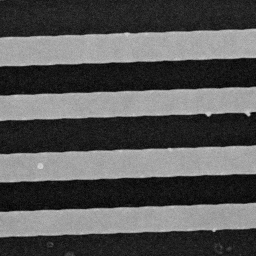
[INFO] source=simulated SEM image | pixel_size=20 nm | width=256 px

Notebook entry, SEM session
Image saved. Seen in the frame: lines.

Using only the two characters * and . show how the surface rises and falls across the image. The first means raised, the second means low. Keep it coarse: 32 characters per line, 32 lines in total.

................................
................................
................................
................................
.......*************************
********************************
********************************
************************........
................................
................................
................................
..............******************
********************************
********************************
***************.................
................................
................................
................................
........................********
********************************
********************************
********************************
******..........................
................................
................................
...............................*
.*******************************
********************************
********************************
*...............................
................................
................................